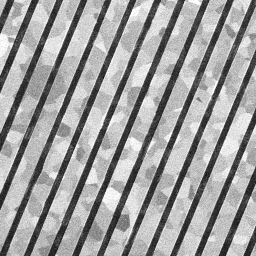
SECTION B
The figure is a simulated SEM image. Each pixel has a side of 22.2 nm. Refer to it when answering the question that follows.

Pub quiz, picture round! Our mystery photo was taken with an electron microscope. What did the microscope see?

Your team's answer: parallel lines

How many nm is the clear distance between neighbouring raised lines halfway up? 156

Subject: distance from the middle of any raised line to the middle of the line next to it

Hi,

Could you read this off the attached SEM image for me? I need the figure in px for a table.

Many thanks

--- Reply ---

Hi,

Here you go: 22.5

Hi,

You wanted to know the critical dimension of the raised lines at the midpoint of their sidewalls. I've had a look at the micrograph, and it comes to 341 nm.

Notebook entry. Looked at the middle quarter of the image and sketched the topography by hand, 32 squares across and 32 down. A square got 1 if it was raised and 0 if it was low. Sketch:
11100111110111110011100011110011
11100111100111100111100111100111
11001111100111100111100111100111
11001111001111001111001111001111
11001111001111001111001111001111
10011110011110011110001111001111
10011110011110011110011110011110
00111110011110011110011110011110
00111100111100111100111100111110
00111100111100111100111100111100
01111001111001111001111100111100
01111001111001111001111001111001
11111001111001111001111001111001
11110011110011110011110011110011
11110011110011110011110011110011
11100111100111100111100111110011
11100111100111100111100111100111
11001111101111100111100111100111
11001111001111001111001111001111
11011111001111001111001111001111
10011110011110011110011111001111
10011110011110011110011110011110
00111100111100111110011110111110
00111100111100111100111100111100
00111100111100111100111100111100
01111001111001111001111101111100
01111001111001111001111001111001
11110011110011110011111001111001
11110011110011110011110011110011
11110011110011110011110011110011
11100111100111100111100111100111
11100111100111100111100111100111